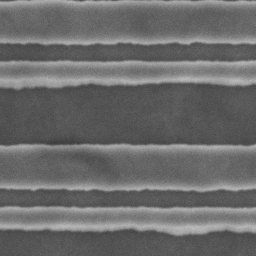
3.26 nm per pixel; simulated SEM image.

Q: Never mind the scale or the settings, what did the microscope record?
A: lines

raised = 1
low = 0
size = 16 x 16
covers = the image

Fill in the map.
1111111111111111
1111111111111111
1111111111111111
1111111111111111
1111111111111111
0000000000000000
0000000000000000
0000000000000000
0000000000000000
1111111111111111
1111111111111111
1111111111111111
1111111111111111
1111111111111111
0000000000000000
0000000000000000